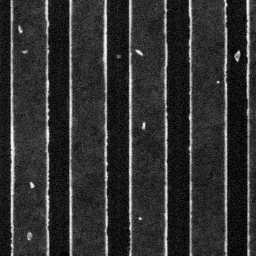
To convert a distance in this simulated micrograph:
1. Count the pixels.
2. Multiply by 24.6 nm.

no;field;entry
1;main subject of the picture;lines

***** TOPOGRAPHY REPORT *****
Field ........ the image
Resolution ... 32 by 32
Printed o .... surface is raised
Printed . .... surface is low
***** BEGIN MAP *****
.ooooo...oooo...ooooo...oooo...o
.ooooo...oooo...ooooo...oooo...o
.ooooo...oooo...ooooo...oooo...o
.ooooo...oooo...ooooo...oooo...o
.ooooo...oooo...ooooo...oooo...o
.ooooo...oooo...ooooo...oooo...o
.ooooo...oooo...ooooo...oooo...o
.ooooo...oooo...ooooo...oooo...o
.ooooo...oooo...ooooo...oooo...o
.ooooo...oooo...ooooo...oooo...o
.ooooo...oooo...ooooo...oooo...o
.ooooo...oooo...ooooo...oooo...o
.ooooo...oooo...ooooo...oooo...o
.ooooo...oooo...ooooo...oooo...o
.ooooo...oooo...ooooo...oooo...o
.ooooo...oooo...ooooo...oooo...o
.ooooo...oooo...ooooo...oooo...o
.ooooo...oooo...ooooo...oooo...o
..oooo...oooo...ooooo...oooo...o
..oooo...oooo...ooooo...oooo...o
..oooo...oooo...ooooo...oooo...o
..oooo...oooo...ooooo...oooo...o
..oooo...oooo...ooooo...oooo...o
..oooo...oooo...ooooo...oooo...o
.ooooo...oooo...ooooo...oooo...o
.ooooo...oooo...ooooo...oooo...o
.ooooo...oooo...ooooo...oooo...o
..oooo...oooo...ooooo...oooo...o
..oooo...oooo...ooooo...oooo...o
..oooo...oooo...ooooo...oooo...o
..oooo...oooo...ooooo...oooo...o
.ooooo...oooo...ooooo...oooo...o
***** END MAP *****